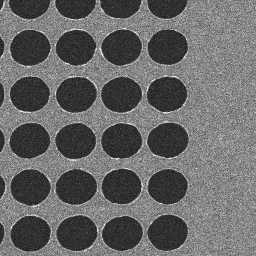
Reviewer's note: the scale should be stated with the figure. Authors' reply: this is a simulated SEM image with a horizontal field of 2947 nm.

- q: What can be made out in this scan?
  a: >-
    a regular array of holes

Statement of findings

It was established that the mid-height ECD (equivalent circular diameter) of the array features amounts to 437 nanometers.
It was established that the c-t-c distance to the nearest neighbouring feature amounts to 0.524 um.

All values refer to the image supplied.